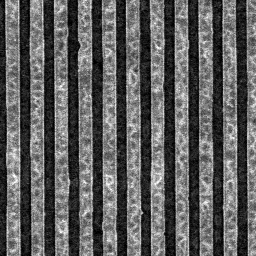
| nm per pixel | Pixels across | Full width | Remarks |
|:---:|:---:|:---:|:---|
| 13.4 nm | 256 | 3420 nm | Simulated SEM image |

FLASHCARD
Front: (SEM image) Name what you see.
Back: parallel lines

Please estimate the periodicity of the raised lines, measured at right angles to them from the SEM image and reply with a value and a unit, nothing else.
322 nm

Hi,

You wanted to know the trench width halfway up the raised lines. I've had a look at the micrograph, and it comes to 160 nm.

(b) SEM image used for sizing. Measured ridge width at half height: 160 nanometres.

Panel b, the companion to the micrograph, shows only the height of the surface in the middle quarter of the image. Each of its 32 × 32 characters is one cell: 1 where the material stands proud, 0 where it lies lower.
10001110001110001110001110001110
10001110001110001110001110001110
10001110001110001110001110001110
10001110001110001110001110001110
10001110001110001110001110001110
10001110001110001110001110001110
10001110001110001110001110001110
10001110001110001110001110001110
10001110001110001110001110001110
10001110001110001110001110001110
10001110001110001110001110001110
10001110001110001110001110001110
10001110001110001110001110001110
10001110001110001110001110001110
10001110001110001110001110001110
10001110001110001110001110001110
10001110001110001110101110001110
10001110001110001110101110001110
10001110001110001110001110001110
10001110001110001110001110001110
10001110001110001110001110001110
10001110001110001110001110001110
10001110001110001110001110001110
10001110001110001110001110001110
10001110001110001110001110001110
10001110001110001110001110001110
10001110001110001110001110001110
10001110001110001110001110001110
10001110001110001110001110001110
10001110001110001110001110001110
10001110001110001110001110001110
10001110001110001110001110001110